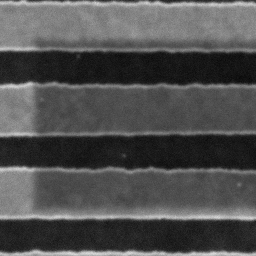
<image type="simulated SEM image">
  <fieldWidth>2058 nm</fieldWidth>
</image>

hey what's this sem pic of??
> lines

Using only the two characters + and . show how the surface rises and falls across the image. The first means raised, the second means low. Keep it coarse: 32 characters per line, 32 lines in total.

+++++++++++++++++++++.+++.+..+++
++++++++++++++++++++++++++++++++
++++++++++++++++++++++++++++++++
++++++++++++++++++++++++++++++++
++++++++++++++++++++++++++++++++
++++++++++++++++++++++++++++++++
................................
................................
................................
................................
...+..+.........................
++++++++++++++++++++++++++++++++
++++++++++++++++++++++++++++++++
++++++++++++++++++++++++++++++++
++++++++++++++++++++++++++++++++
++++++++++++++++++++++++++++++++
++++++++++++++++++++++++++++++++
................................
................................
................................
................................
++++++++++++++++++++++++++++++++
++++++++++++++++++++++++++++++++
++++++++++++++++++++++++++++++++
++++++++++++++++++++++++++++++++
++++++++++++++++++++++++++++++++
++++++++++++++++++++++++++++++++
................................
................................
................................
................................
....+...........................